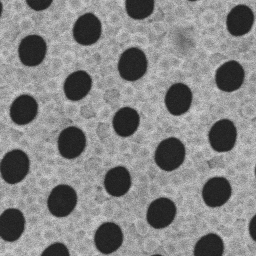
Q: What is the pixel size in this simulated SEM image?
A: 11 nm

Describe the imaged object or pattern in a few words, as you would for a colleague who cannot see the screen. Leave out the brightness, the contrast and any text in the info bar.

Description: a regular array of holes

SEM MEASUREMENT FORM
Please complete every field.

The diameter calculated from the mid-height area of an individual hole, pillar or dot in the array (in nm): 333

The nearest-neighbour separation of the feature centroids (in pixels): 56.9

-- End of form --